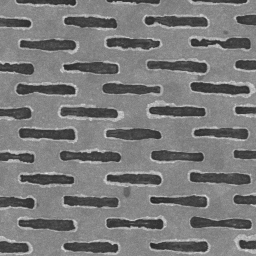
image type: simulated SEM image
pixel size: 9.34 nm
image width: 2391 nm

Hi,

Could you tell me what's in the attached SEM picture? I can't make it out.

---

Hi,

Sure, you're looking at a regular array of holes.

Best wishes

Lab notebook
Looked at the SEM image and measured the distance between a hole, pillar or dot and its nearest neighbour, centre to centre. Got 44.7 pixels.